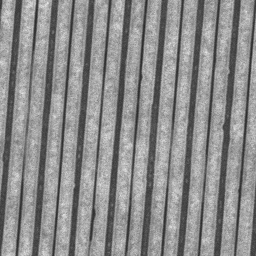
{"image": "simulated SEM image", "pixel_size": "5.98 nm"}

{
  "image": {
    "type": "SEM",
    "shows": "parallel lines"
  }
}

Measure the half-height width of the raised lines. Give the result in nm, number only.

75.9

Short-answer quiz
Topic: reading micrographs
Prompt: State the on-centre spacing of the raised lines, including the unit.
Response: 0.108 µm